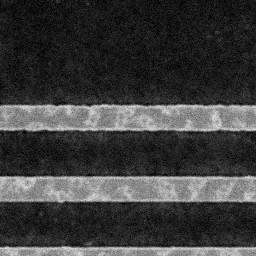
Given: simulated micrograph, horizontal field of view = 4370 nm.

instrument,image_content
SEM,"one or a few lines or trenches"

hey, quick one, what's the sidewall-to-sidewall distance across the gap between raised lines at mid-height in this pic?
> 815 nanometres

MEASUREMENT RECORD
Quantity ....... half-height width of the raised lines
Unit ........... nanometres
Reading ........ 393